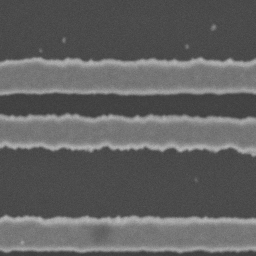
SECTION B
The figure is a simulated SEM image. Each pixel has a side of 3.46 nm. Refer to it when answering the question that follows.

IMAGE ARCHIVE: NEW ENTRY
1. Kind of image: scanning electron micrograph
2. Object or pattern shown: lines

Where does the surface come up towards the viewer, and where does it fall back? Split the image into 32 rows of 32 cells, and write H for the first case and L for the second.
LLLLLLLLLLLLLLLLLLLLLLLLLLLLLLLL
LLLLLLLLLLLLLLLLLLLLLLLLLLLLLLLL
LLLLLLLLLLLLLLLLLLLLLLLLLLLLLLLL
LLLLLLLLLLLLLLLLLLLLLLLLLLLLLLLL
LLLLLLLLLLLLLLLLLLLLLLLLLLLLLLLL
LLLLLLLLLLLLLLLLLLLLLLLLLLLLLLLL
LLLLLLLLLLLLLLLLLLLLLLLLLLLLLLLL
LLHHHHLLHHLLLHHLLHHHLLLLHHLLHLLL
HHHHHHHHHHHHHHHHHHHHHHHHHHHHHHHH
HHHHHHHHHHHHHHHHHHHHHHHHHHHHHHHH
HHHHHHHHHHHHHHHHHHHHHHHHHHHHHHHH
HHHHHHHHHHHHHHHHHHHHHHHHHHHHHHHH
LLLLLLLLLLLLLLLLLLLLLLLLLLLLLLLL
LLLLLLLLLLLLLLLLLLLLLLLLLLLLLLLL
HLLHHHHLHHLLLHHLLLHHLHLLLLLLLLLL
HHHHHHHHHHHHHHHHHHHHHHHHHHHHHHHH
HHHHHHHHHHHHHHHHHHHHHHHHHHHHHHHH
HHHHHHHHHHHHHHHHHHHHHHHHHHHHHHHH
LHLLLLHHHHHHHLHHHHLHHLHHHHHHHHHH
LLLLLLLLLLLLLLLLLLLLLLLLLLLLLLLL
LLLLLLLLLLLLLLLLLLLLLLLLLLLLLLLL
LLLLLLLLLLLLLLLLLLLLLLLLLLLLLLLL
LLLLLLLLLLLLLLLLLLLLLLLLLLLLLLLL
LLLLLLLLLLLLLLLLLLLLLLLLLLLLLLLL
LLLLLLLLLLLLLLLLLLLLLLLLLLLLLLLL
LLLLLLLLLLLLLLLLLLLLLLLLLLLLLLLL
LLLLLLLLLLLLLLLLLLLLLLLLLLLLLLLL
HHHHHHHHHHHHHHHHHHHHHHHHHHHHHHHH
HHHHHHHHHHHHHHHHHHHHHHHHHHHHHHHH
HHHHHHHHHHHHHHHHHHHHHHHHHHHHHHHH
HHHHHHHHHHHHHHHHHHHHHHHHHHHHHHHH
HLLLLLLLLHHLLLLLLLLLLLHLLLHHLLLL